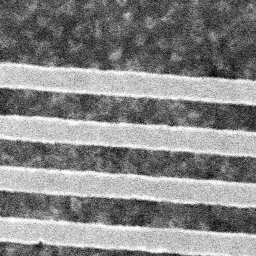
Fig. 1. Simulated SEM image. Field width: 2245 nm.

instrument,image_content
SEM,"parallel lines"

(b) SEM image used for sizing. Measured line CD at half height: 200 nanometers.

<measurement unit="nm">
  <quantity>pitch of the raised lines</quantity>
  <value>449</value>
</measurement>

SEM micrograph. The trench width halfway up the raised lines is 248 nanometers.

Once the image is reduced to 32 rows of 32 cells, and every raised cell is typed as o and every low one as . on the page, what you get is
................................
................................
................................
................................
................................
................................
................................
................................
ooooooo.........................
oooooooooooooooooooooo..........
oooooooooooooooooooooooooooooooo
.........ooooooooooooooooooooooo
.........................ooooooo
................................
................................
oooooooooooooo.o................
oooooooooooooooooooooooooooooo..
...ooooooooooooooooooooooooooooo
..................oooooooooooooo
................................
................................
oooooooo........................
oooooooooooooooooooooooo........
oooooooooooooooooooooooooooooooo
..........o.oooooooooooooooooooo
.........o.................ooooo
................................
oooo.o..........................
ooooooooooooooooo...............
oooooooooooooooooooooooooooooooo
......oooooooooooooooooooooooooo
...................ooooooooooooo